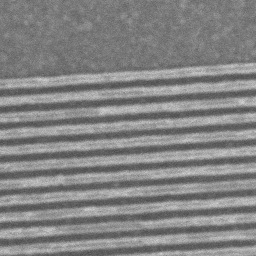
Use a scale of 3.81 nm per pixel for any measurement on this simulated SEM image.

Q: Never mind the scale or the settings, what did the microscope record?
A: parallel lines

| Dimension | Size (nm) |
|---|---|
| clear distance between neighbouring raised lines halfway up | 34.2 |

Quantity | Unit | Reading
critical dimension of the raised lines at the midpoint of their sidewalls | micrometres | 0.0271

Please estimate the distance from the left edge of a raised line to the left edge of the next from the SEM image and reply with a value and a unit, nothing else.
0.0632 um